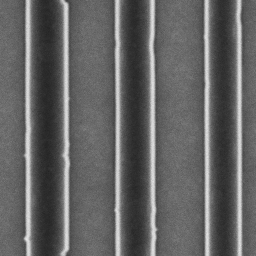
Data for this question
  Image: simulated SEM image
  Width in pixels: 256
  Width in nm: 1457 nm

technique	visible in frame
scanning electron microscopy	one or a few lines or trenches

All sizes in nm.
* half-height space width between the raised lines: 296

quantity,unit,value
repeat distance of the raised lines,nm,500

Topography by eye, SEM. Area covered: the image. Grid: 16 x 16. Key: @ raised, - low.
--@@---@@@---@@-
--@@---@@@---@@-
--@@---@@@---@@-
--@@---@@@---@@-
--@@---@@@---@@-
--@@---@@@---@@-
--@@---@@@---@@-
--@@---@@@---@@-
--@@---@@@---@@-
--@@---@@@---@@-
--@@---@@@---@@-
--@@---@@@---@@-
--@@---@@@---@@-
--@@---@@@---@@-
--@@---@@@---@@-
--@@---@@@---@@-